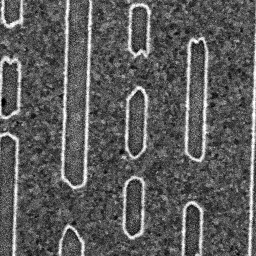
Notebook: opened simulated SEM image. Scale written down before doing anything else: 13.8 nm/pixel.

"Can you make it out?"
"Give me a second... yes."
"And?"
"one or a few lines or trenches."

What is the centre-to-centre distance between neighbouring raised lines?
869 nanometers